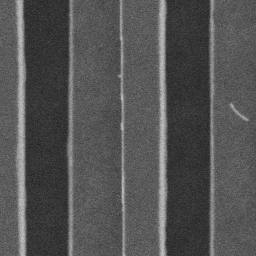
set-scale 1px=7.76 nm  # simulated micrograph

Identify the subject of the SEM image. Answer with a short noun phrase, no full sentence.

lines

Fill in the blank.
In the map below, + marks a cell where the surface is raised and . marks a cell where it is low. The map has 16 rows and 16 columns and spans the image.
+...++++++...+++
+...++++++...+++
+...++++++...+++
+...++++++...+++
+...++++++...+++
+...++++++...+++
+...++++++...+++
+...++++++...+++
+...++++++...+++
+...++++++...+++
+...++++++...+++
+...++++++...+++
+...++++++...+++
+...++++++...+++
+...++++++...+++
+...++++++...+++